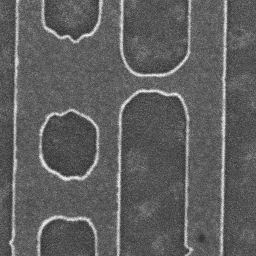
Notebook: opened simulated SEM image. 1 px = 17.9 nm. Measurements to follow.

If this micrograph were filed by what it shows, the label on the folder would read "one or a few lines or trenches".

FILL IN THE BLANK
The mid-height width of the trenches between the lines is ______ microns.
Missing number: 1.19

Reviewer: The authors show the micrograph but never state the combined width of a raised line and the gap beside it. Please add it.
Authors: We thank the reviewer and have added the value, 1620 nanometers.